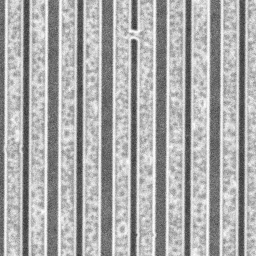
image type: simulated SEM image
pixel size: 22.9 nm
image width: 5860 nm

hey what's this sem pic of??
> parallel lines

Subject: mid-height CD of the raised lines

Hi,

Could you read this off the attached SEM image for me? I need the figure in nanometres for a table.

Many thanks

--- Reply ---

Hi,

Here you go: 381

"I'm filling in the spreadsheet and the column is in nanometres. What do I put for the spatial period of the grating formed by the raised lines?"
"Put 618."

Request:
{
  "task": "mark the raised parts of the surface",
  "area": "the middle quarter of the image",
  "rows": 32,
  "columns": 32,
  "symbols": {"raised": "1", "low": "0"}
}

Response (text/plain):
11100111100001110001110000111100
11100111100001110001110000111100
11100111100001110001110000111100
11100111100001110001110000111100
11100111100001110001110000111100
11100111100001110001110000111100
11100111100001110001110000111100
11100111100001110001110000111100
11100111100001110001110000111100
11100111100001110001110000111100
11100111100001110001110000111100
11100111100001110001110000111100
11100111100001110001110000111100
11100111100001110001110000111100
11100111100001110001110000111100
11100111100001110001110000111100
11100111100001110001110000111100
11100111100001110001110000111100
11100111100001110001110000111100
11100111100001110001110000111100
11100111100001110001110000111100
11100111100001110001110000111100
11100111100001110001110000111100
11100111100001110001111000111100
11100111100001110001111000111100
11100111100001110001111000111100
11100111100001110001111000111100
11100111100001110001111000111100
11100111100001110001111000111100
11100111100001110001110000111100
11100111100001110001110000111100
11100111100001110001110000111100